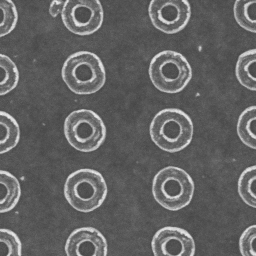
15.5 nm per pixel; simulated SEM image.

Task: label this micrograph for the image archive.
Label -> ring-shaped raised bodies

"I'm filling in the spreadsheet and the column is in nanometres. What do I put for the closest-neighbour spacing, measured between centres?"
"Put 900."